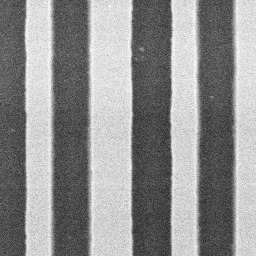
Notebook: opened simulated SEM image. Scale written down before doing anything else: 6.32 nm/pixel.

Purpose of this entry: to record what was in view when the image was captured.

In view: lines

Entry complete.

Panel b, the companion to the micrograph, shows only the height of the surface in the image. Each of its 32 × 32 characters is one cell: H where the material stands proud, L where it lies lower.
LLLHHHLLLLLLHHHHLLLLLHHHLLLLLHHH
LLLHHHLLLLLLHHHHLLLLLLHHLLLLLLHH
LLLHHHLLLLLHHHHHLLLLLLHHLLLLLLHH
LLLHHHLLLLLLHHHHLLLLLLHHLLLLLLHH
LLLHHHLLLLLLHHHHLLLLLLHHLLLLLLHH
LLLHHHLLLLLHHHHHLLLLLLHHLLLLLLHH
LLLHHHLLLLLHHHHHLLLLLLHHLLLLLLHH
LLLHHHLLLLLHHHHHLLLLLLHHLLLLLLHH
LLLHHHLLLLLHHHHHLLLLLLHHLLLLLLHH
LLLHHHLLLLLHHHHHLLLLLLHHLLLLLLHH
LLLHHHLLLLLLHHHHLLLLLLHHLLLLLLHH
LLLHHHLLLLLLHHHHLLLLLLHHLLLLLLHH
LLLHHHLLLLLHHHHHLLLLLLHHHLLLLLHH
LLLHHHLLLLLLHHHHLLLLLHHHHLLLLLHH
LLLHHHLLLLLLHHHHLLLLLHHHHLLLLLHH
LLLHHHLLLLLLHHHHLLLLLHHHHLLLLLHH
LLLHHHLLLLLLHHHHLLLLLHHHHLLLLLHH
LLLHHHLLLLLLHHHHLLLLLHHHLLLLLLHH
LLLHHHLLLLLLHHHHLLLLLHHHLLLLLLHH
LLLHHHLLLLLLHHHHLLLLLLHHLLLLLLHH
LLLHHHLLLLLLHHHHLLLLLLHHHLLLLLHH
LLLHHHLLLLLLHHHHLLLLLLHHLLLLLLHH
LLLHHHLLLLLLHHHHLLLLLLHHLLLLLLHH
LLLHHHLLLLLLHHHHLLLLLLHHLLLLLLHH
LLLHHHLLLLLLHHHHLLLLLLHHLLLLLLHH
LLLHHHLLLLLLHHHHLLLLLLHHLLLLLLHH
LLLHHHLLLLLLHHHHLLLLLLHHLLLLLLHH
LLLHHHLLLLLLHHHHLLLLLHHHLLLLLLHH
LLLHHHLLLLLLHHHHLLLLLHHHLLLLLLHH
LLLHHHLLLLLLHHHHLLLLLLHHLLLLLLHH
LLLHHHLLLLLLHHHHLLLLLLHHHLLLLLHH
LLLHHHLLLLLLHHHHLLLLLLHHHLLLLLHH